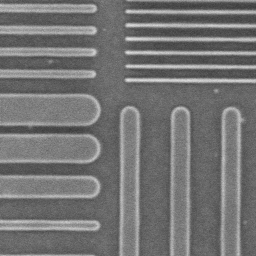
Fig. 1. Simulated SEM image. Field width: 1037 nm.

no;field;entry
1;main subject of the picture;groups of lines, slits or small figures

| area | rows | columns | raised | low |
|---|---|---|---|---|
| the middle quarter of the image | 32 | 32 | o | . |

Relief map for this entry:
................oooooooooooooooo
................................
oooooooo........................
................................
................................
................................
................................
................................
ooooooo.........................
oooooooo........................
ooooooooo.......................
ooooooooo......ooo..........ooo.
ooooooooo.....ooooo........oooo.
oooooooo......ooooo........oooo.
oooooooo......ooooo........oooo.
..............ooooo........oooo.
..............ooooo........oooo.
..............ooooo........oooo.
oooooooo......ooooo........oooo.
oooooooo......ooooo........oooo.
ooooooooo.....ooooo........oooo.
ooooooooo.....ooooo........oooo.
ooooooooo.....ooooo........oooo.
oooooooo......ooooo........oooo.
oooooo........ooooo........oooo.
..............ooooo........oooo.
..............ooooo........oooo.
..............ooooo........oooo.
oooooooo......ooooo........oooo.
oooooooo......ooooo........oooo.
ooooooooo.....ooooo........oooo.
ooooooooo.....ooooo........oooo.